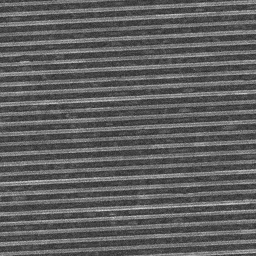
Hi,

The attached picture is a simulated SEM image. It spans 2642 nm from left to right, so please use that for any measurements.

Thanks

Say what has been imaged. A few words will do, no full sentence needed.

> parallel lines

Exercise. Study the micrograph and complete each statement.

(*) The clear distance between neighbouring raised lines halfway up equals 73.4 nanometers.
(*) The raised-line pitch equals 103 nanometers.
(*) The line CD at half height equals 32.2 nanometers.